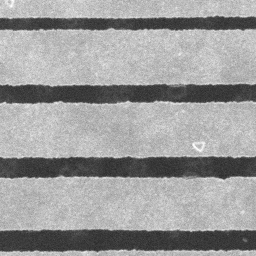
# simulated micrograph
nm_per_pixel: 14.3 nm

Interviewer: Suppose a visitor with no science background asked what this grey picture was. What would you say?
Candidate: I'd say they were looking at one or a few lines or trenches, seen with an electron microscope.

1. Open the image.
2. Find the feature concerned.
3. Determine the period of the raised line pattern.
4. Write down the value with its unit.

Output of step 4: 1050 nm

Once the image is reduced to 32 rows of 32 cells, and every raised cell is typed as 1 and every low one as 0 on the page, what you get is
11111111111111111111111111111111
11111111111111111111111111111111
00000000000000000000000000000000
00000000000000000000000000000000
11111111111111111111111111111111
11111111111111111111111111111111
11111111111111111111111111111111
11111111111111111111111111111111
11111111111111111111111111111111
11111111111111111111111111111111
11111111111111111110011111000001
00000000000000000000011000000000
00000000000000000000000000000000
11111111111111111111111111111111
11111111111111111111111111111111
11111111111111111111111111111111
11111111111111111111111111111111
11111111111111111111111111111111
11111111111111111111111111111111
11111111111111111111111111011111
00000000000000000000000000000000
00000000000000000000000000000000
11111111111111111111111111111111
11111111111111111111111111111111
11111111111111111111111111111111
11111111111111111111111111111111
11111111111111111111111111111111
11111111111111111111111111111111
11111111111111111111111111111111
00000000000000000000000000000000
00000000000000000000000000000000
00011000111111111111111111111111